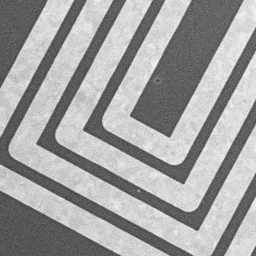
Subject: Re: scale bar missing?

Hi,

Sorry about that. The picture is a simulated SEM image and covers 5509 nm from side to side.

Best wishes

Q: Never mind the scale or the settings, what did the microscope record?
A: groups of lines, slits or small figures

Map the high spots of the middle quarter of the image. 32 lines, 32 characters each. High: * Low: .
***....******....******.........
***...*******...******..........
**....******....******..........
**...*******...******...........
*....******....******...........
*...******....******............
....******....******............
...******....******.............
...******...*******.............
..******....******..............
.*******...*******.............*
.******....******.............**
*******...******..............**
******....*******............***
*****.....*********..........***
*****.....***********.......****
*****......***********......****
******.......***********...*****
********.......*****************
*****.****......****************
************......**************
..************......***********.
....***********.......*********.
.....************.......******..
*.......***********.......***...
***.......***********...........
****.......************.........
******.......************.......
********.......***********.....*
**********.......***********...*
************.......*************
..************.......***********